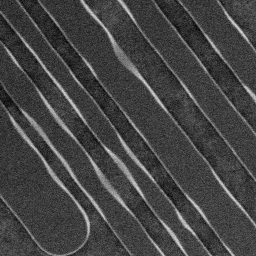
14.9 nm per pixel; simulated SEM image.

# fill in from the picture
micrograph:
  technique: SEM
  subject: groups of lines, slits or small figures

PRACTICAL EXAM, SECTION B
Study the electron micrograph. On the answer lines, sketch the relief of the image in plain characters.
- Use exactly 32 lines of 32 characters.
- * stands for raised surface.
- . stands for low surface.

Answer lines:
***..******....****....*****....
***...*****.....****...*****....
.***...*****.....****...*****...
..***..******....*****...*****..
..***...******....****....*****.
...***...*****.....****....****.
*...***...*****.....****...*****
**...***..******....*****...****
***...***..*****.....*****...***
***...***...*****.....****....**
****...***...*****.....****...**
.****...***..******.....****...*
..****...***..******....*****...
*.****...***...******....****...
*..****...***...*****.....****..
**..****...***..******.....****.
***..****...***..******....*****
***...****..***...******....****
****...***...***...*****.....***
*****..****...***...*****.....**
******..****...**...******....**
******...***....**...******....*
*******..****...***...*****.....
********..****...***..******....
*********..****...***..******...
.*********..***...****..******..
..********...***...***...******.
..*********..****...***...*****.
...********...****...***..******
....*******....****...***..*****
.....*****.....****...***...****
......***.......****...***...***